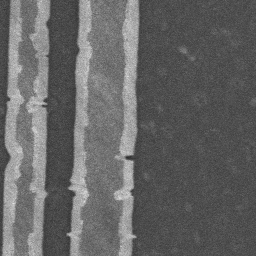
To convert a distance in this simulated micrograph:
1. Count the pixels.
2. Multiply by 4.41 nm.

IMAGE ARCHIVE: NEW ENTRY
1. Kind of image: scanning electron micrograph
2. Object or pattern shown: one or a few lines or trenches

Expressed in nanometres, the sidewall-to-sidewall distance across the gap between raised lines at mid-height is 169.